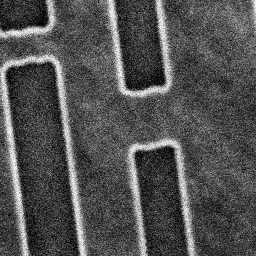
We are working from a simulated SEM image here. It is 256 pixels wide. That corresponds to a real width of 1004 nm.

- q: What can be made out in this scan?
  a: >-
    one or a few lines or trenches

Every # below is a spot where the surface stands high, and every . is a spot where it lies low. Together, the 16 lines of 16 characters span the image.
...####...######
...####...######
#######...######
#######...######
....####..######
....####..######
....############
#...############
#...############
#...####...#####
#...####...#####
#....###...#####
#....####..#####
#....####...####
#....####...####
##...####...####